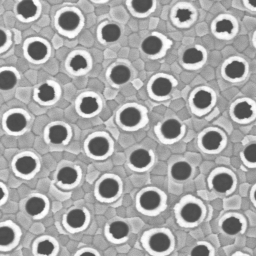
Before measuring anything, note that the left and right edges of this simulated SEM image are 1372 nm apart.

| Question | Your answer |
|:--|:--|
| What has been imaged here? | a regular array of holes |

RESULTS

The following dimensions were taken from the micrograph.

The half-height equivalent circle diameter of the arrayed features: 98.1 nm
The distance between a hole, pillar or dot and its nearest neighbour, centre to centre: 0.229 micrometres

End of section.